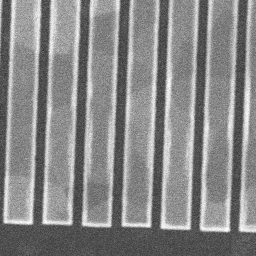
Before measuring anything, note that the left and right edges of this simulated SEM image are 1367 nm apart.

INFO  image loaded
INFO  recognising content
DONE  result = parallel lines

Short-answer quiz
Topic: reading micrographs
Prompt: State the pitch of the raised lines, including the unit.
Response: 0.208 micrometres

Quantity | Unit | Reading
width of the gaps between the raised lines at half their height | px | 12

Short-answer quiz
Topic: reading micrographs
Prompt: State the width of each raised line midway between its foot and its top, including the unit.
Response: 143 nanometers